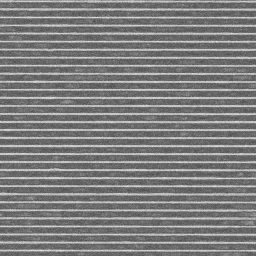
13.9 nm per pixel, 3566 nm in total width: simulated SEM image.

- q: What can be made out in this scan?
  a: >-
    parallel lines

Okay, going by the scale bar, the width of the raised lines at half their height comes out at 17.4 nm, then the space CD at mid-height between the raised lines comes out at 92.3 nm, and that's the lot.